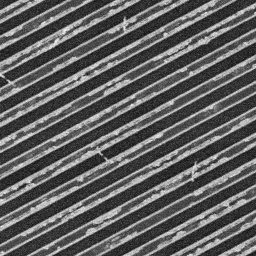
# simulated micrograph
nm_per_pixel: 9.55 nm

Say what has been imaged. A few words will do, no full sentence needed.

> parallel lines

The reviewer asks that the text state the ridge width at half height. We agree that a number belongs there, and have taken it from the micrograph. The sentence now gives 9.58 pixels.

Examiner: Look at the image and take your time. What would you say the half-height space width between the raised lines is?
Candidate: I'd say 0.124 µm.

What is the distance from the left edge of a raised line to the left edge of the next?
22.9 px